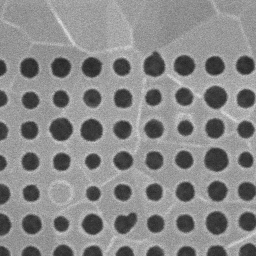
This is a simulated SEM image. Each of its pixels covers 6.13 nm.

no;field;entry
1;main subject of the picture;a regular array of holes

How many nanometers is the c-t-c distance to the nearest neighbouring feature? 186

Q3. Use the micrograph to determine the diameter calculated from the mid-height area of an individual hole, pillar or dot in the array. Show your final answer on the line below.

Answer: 122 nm